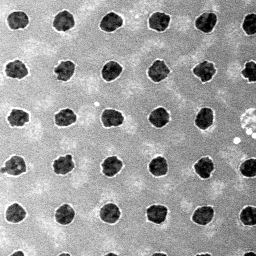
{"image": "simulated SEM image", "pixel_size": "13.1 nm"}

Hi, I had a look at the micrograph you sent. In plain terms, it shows a regular array of raised bodies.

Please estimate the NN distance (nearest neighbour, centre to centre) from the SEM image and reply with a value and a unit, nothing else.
46.3 pixels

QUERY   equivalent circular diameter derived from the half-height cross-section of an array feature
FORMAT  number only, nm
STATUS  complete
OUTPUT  283